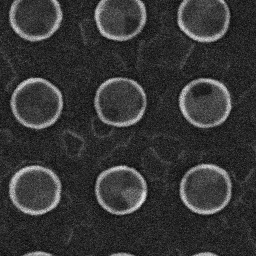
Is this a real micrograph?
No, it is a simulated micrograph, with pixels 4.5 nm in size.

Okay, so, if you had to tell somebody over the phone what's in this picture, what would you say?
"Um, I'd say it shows raised bodies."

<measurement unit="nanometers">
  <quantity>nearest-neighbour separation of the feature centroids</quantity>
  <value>383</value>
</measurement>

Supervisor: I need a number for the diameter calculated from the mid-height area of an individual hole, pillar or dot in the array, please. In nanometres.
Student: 216